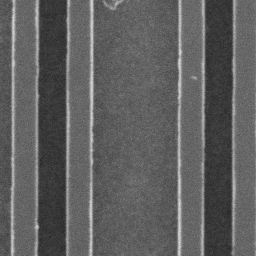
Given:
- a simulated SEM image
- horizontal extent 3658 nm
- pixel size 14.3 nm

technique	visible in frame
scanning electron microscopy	lines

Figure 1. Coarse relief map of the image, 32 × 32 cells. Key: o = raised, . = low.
..ooo...oooo..........oooo...ooo
..ooo...oooo..........oooo...ooo
..ooo...oooo..........oooo...ooo
..ooo...oooo..........oooo...ooo
..ooo...oooo..........oooo...ooo
..ooo...oooo..........oooo...ooo
..ooo...oooo..........oooo...ooo
..ooo...oooo..........oooo...ooo
..ooo...oooo..........oooo...ooo
..ooo...oooo..........oooo...ooo
..ooo...oooo..........oooo...ooo
..ooo...oooo..........oooo...ooo
..ooo...oooo..........oooo...ooo
..ooo...oooo..........oooo...ooo
..ooo...ooo...........oooo...ooo
..ooo...oooo..........oooo...ooo
..ooo...ooo...........oooo...ooo
..ooo...ooo...........oooo...ooo
..ooo...ooo...........oooo...ooo
..ooo...ooo...........ooo....ooo
..ooo...oooo..........ooo....ooo
..ooo...ooo...........ooo....ooo
..ooo...ooo...........ooo....ooo
..ooo...ooo...........ooo....ooo
.oooo...ooo...........ooo....ooo
.oooo...ooo...........ooo....ooo
.oooo...ooo...........ooo....ooo
.oooo...ooo...........ooo....ooo
.oooo...ooo...........ooo....ooo
.oooo...ooo...........ooo....ooo
.oooo...ooo...........ooo....ooo
.oooo...ooo...........ooo....ooo